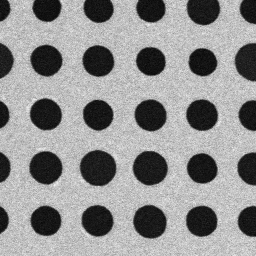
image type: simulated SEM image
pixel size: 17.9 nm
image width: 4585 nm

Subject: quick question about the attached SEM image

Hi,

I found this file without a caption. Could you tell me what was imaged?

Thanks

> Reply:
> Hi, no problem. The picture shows a regular array of holes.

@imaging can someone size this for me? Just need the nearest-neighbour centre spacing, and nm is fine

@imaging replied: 929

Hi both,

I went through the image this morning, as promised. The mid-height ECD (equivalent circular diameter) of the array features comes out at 31.9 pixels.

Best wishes